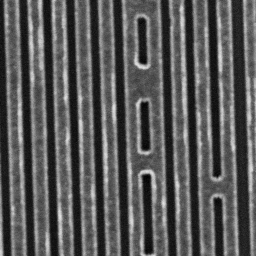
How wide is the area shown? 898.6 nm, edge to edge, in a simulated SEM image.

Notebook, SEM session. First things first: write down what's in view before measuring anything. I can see parallel lines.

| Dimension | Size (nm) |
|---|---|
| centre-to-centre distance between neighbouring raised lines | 82.7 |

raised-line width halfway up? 45.1 nm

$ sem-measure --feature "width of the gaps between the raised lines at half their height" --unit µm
0.0386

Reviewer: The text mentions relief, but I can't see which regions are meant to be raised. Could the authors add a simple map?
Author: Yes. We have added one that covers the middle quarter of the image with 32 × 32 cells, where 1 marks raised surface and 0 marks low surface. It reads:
00011100011100011111111100011100
10011100011100011111111100011100
10001110011100011111111100011100
10001110001110011111111100011100
10001110001110001111111100011100
10001110001110001111111100011100
10001110001110001111111100011100
10001110001110001111111100011100
10001110001110001111111100011100
10001110001110001110011100011100
10001110001110001110011100011100
10001110001110001110011100011100
10001110001110001110001100011100
10001110001110001110001110001100
10001110001110001110001110001110
10001110001110001110001110001110
10001110001110001110001110001110
10001110001110001110001110001110
10001110001110001110001110001110
10001110001110001110001110001110
10001110001110001110001110001110
10001110001110001110001110001110
10001110001110001111111110001110
10001110001110001111111110001110
10001110001110001111111110001110
10001110001110001111111110001110
10001110001110001111111110001110
11001110001110001110011110001110
11001110001110001110001110001110
11001110001110001110001110001110
11001110001110001110001110001110
11001110001110001110001110001110